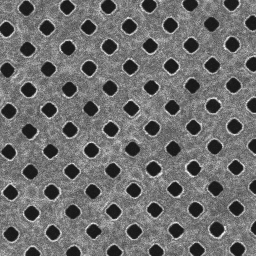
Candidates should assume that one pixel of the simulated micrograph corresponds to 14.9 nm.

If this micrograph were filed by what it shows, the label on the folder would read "a regular array of holes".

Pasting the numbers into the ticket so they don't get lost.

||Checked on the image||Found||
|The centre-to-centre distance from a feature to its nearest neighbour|0.427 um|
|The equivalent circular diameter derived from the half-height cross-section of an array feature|14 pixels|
